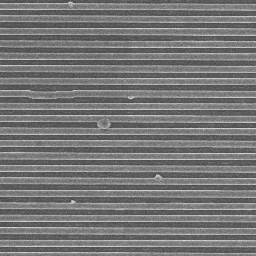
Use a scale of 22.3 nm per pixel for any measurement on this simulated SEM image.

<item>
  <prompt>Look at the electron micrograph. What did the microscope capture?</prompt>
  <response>parallel lines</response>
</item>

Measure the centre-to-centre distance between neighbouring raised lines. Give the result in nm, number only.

278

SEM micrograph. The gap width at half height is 125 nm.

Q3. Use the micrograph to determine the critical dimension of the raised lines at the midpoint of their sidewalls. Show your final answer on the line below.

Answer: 145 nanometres